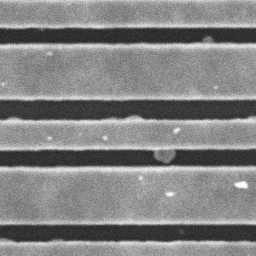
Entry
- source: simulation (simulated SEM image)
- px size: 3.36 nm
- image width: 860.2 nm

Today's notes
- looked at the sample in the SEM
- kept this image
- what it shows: lines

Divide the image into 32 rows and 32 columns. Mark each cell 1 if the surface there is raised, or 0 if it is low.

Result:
11111111111111111111111111111111
11111111111111111111111111111111
11111111111111111111111111111111
00000000000000000000000000000000
00000000000000000000000000000000
00111111011111111111111111111111
11111111111111111111111111111111
11111111111111111111111111111111
11111111111111111111111111111111
11111111111111111111111111111111
11111111111111111111111111111111
11111111111111111111111111111111
00000000000001000000000000000000
00000000000000000000000000000000
00000000000000000000000000000000
11111111111111111111111111111111
11111111111111111111111111111111
11111111111111111111111111111111
11111111111111111111111111111111
00000000000000000000000000000000
00000000000000000000000000000000
11111111111111111111111111111111
11111111111111111111111111111111
11111111111111111111111111111111
11111111111111111111111111111111
11111111111111111111111111111111
11111111111111111111111111111111
11111111111111111111111111111111
00000000000000000000000000000000
00000000000000000000000000000000
11111111111111111111111111111111
11111111111111111111111111111111